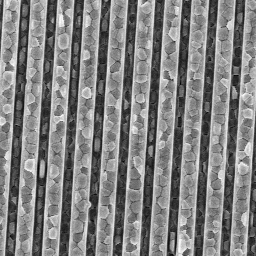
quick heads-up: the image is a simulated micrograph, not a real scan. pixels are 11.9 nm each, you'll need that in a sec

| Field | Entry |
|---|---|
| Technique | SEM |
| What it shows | parallel lines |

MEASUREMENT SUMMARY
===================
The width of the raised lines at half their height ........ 192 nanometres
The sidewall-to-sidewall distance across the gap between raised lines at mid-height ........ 0.123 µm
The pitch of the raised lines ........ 0.319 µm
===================